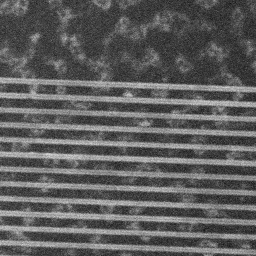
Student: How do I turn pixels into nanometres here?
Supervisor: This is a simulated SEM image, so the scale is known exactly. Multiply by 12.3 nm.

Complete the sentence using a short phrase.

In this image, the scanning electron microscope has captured parallel lines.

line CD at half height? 43 nanometres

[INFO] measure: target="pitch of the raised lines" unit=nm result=182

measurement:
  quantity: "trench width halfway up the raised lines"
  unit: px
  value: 11.4